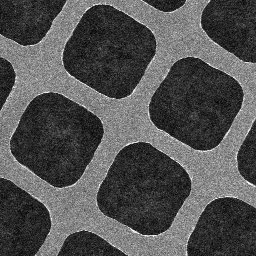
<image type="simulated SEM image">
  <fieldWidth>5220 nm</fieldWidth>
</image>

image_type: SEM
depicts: holes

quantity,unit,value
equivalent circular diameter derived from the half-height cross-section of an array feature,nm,1810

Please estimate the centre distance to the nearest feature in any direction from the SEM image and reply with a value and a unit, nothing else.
2.05 µm